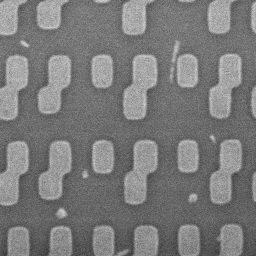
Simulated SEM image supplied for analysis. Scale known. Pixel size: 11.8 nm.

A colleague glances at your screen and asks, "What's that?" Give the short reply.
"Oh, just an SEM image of wiring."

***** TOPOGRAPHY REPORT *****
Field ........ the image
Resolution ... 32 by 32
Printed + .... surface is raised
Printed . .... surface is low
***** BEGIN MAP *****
+++..+++........+++........++...
++...++........+++........+++...
++...++........+++........+++...
++.............+++........+++...
................................
................................
................................
.++...+++...++...++...+++...++..
.++...+++...++...+++..+++...++..
.++...+++...++...+++..+++...++..
.++...++....++..+++....+...+++..
++...+++........++........+++...
++...++.........++........+++...
++...++.........++........+++...
++..............++.........+....
................................
................................
................................
.++...+++...++...+++..+++...++..
.++...+++...++...+++..+++...++..
.++...+++...++...+++..+++...++..
.++...++....+...+++........++...
++...+++........++........+++...
++...+++........++........+++...
++...++.........++........+++...
................................
................................
................................
..+....+....++...++....++...++..
.+++..+++...++...+++..+++...++..
.+++..+++...++...+++..+++...++..
.+++..+++...++...+++..+++...++..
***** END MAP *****